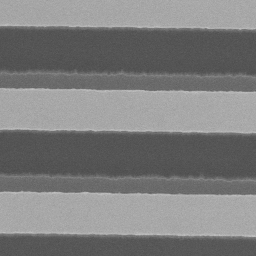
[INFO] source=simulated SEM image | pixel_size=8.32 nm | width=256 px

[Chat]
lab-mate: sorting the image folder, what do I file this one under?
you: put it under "lines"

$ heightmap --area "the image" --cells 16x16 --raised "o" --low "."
oooooooooooooooo
oooooooooooooooo
................
................
................
oooooooooooooooo
oooooooooooooooo
oooooooooooooooo
................
................
................
oooooooooooooooo
oooooooooooooooo
oooooooooooooooo
oooooooooooooooo
................